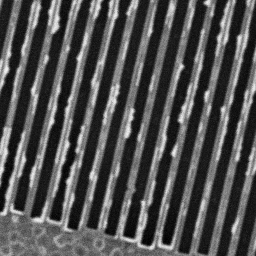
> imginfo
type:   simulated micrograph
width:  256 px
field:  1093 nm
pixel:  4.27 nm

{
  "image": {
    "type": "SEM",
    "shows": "parallel lines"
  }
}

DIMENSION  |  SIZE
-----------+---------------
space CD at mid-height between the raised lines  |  50.4 nm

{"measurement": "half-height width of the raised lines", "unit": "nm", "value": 29.1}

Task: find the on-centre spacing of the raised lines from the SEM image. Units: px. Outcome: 18.9